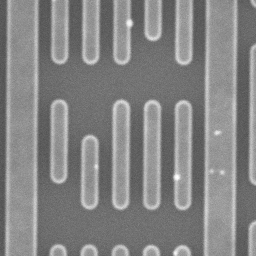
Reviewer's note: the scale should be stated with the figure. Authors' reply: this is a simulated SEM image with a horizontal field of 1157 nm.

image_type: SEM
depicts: groups of lines, slits or small figures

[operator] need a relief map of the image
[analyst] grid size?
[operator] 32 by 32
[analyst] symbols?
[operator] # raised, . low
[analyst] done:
.####..#..##..##..##..##..####..
.####..#..##..##..##..##..####..
.####..#..##..##..##..##..####..
.####..#..##..##..##..##..####..
.####..#..##..##..##..##..####..
.####..#..##..##......##..###...
.####..#..##..##......##..###..#
.####..#...#..##......##..###..#
.####.....................###..#
.####.....................###..#
.####.....................###..#
.####.....................###..#
.####.....................###..#
.####.##......##..##..##..###..#
.####.##......##..##..##..###..#
.####.##......##..##..##..###..#
.####.##......##..##..##..###..#
.####.##..##..##..##..##..###..#
.####.##..##..##..##..##..###..#
.####.##..##..##..##..##..###..#
.####.##..##..##..##..##..###..#
.####.##..##..##..##..##..###..#
.####..#..##..##..##..##..###..#
.####.....##..##..##..##..###...
.####.....##..##..##..##..###...
.####.....##..##..##..##..###...
.####.....................###...
.###......................###...
.###......................###..#
.###......................###..#
.###......................###..#
.###..##..##..##..##..##..###..#